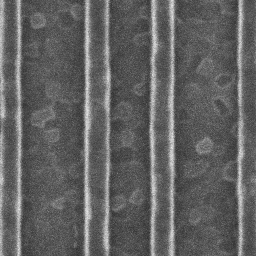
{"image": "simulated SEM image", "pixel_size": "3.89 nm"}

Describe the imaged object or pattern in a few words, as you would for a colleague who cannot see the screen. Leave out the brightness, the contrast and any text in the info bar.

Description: one or a few lines or trenches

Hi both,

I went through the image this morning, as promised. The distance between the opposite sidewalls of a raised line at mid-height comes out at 20.1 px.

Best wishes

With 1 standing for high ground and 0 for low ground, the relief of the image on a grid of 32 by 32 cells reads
11000000000110000001110000000011
11000000000110000001110000000011
11000000000110000001110000000011
11000000000110000001110000000011
11000000000110000001110000000011
11000000000110000001110000000011
11000000000110000001110000000011
11000000000110000001110000000011
11000000000111000001110000000011
11000000000111000001110000000011
11000000000111000001110000000011
11000000000111000001110000000011
11000000000111000001110000000011
11000000000110000001110000000011
11000000000111000001110000000011
11000000000111000001110000000011
11000000000110000001110000000011
11000000000110000001110000000011
11000000000110000001110000000011
11000000000110000001110000000011
11000000000111000001110000000011
11000000000110000001110000000011
11000000000110000001110000000011
11000000000110000001110000000011
11000000000110000001110000000011
11000000000110000001110000000011
11000000000110000001110000000011
11000000000110000001110000000011
11000000000110000001110000000011
11000000000110000001110000000011
11000000000110000001110000000011
11000000000110000001110000000011